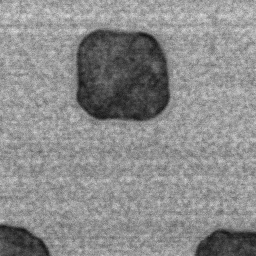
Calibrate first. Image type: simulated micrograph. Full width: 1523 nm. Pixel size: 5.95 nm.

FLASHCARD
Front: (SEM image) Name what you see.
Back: holes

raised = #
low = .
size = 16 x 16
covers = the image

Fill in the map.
################
################
#####.....######
#####.....######
#####......#####
#####......#####
#####.....######
########.#######
################
################
################
################
################
################
..###########...
...#########....